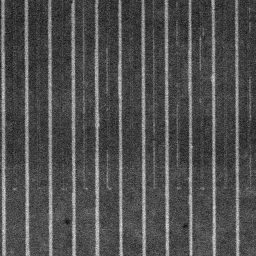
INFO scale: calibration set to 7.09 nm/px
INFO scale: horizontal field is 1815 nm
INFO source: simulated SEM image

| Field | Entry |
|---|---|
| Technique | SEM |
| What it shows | parallel lines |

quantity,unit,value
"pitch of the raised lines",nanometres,82.8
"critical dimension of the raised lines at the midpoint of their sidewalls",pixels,2.37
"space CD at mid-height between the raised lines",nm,65.5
